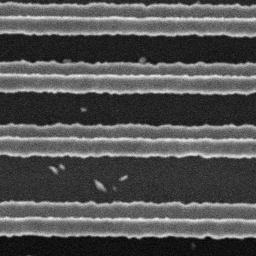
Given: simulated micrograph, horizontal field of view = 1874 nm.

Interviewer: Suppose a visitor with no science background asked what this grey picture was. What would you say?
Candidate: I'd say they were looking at lines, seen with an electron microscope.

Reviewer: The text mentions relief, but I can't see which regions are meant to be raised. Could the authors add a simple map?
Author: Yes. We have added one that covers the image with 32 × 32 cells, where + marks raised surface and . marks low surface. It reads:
+++........++...................
++++++++++++++++++++++++++++++++
++++++++++++++++++++++++++++++++
++++++++++++++++++++++++++++++++
.............................+++
................................
................................
................................
++++++++++++++++++++++++++++++++
++++++++++++++++++++++++++++++++
++++++++++++++++++++++++++++++++
++....++++++++++++++++++++++++++
................................
................................
................................
.......+........................
++++++++++++++++++++++++++++++++
++++++++++++++++++++++++++++++++
++++++++++++++++++++++++++++++++
..........+......+..+.+..+++++++
................................
................................
................................
................................
................................
+++++++++++++++++++++++.+++++++.
++++++++++++++++++++++++++++++++
++++++++++++++++++++++++++++++++
++++++++++++++++++++++++++++++++
.+...+++++..+++++++++.++++++++++
................................
................................